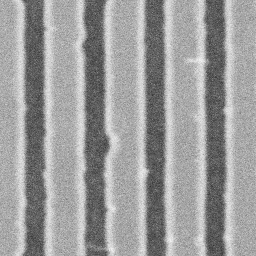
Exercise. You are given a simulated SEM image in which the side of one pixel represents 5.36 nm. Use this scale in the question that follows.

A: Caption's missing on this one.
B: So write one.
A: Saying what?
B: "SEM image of parallel lines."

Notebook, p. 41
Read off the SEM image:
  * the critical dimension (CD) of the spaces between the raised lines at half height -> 140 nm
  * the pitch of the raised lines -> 323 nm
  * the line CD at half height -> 0.179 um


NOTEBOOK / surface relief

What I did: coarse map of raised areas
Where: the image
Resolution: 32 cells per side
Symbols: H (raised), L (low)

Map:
HHHLLLHHHHLLLLHHHHLLLHHHHLLLLHHH
HHHLLLHHHHLLLHHHHHLLLHHHHLLLLHHH
HHHLLLHHHHLLLHHHHHLLLHHHHLLLLHHH
HHHLLLHHHHLLLHHHHHLLLHHHHLLLLHHH
HHHLLLHHHHLLLHHHHHLLLHHHHLLLLHHH
HHHLLLHHHHLLLHHHHHLLLHHHHLLLLHHH
HHHLLLHHHHLLLLHHHHLLLHHHHLLLLHHH
HHHLLLHHHHLLLLHHHHLLLHHHHLLLLHHH
HHHLLLHHHHLLLLHHHHLLLHHHHLLLLHHH
HHHLLLHHHHLLLLHHHHLLLHHHHLLLLHHH
HHHLLLHHHHLLLLHHHHLLLHHHHLLLHHHH
HHHLLLHHHHLLLHHHHHLLLHHHHLLLLHHH
HHHLLLHHHHLLLLHHHHLLLHHHHLLLLHHH
HHHLLLHHHHLLLLHHHHLLLHHHHLLLLHHH
HHHLLLHHHHLLLLHHHHLLLHHHHLLLLHHH
HHHLLLHHHHLLLLHHHHLLLHHHHLLLLHHH
HHHLLLHHHHLLLLHHHHLLLHHHHLLLLHHH
HHHLLLHHHHLLLLHHHHLLLHHHHLLLLHHH
HHHLLLHHHHLLLLHHHHLLLHHHHLLLLHHH
HHHLLLHHHHLLLLHHHHLLLHHHHLLLLHHH
HHHLLLHHHHLLLLHHHHLLLHHHHLLLLHHH
HHHLLLHHHHLLLHHHHHLLLHHHHLLLLHHH
HHHLLLHHHHLLLLHHHHLLLHHHHLLLLHHH
HHHLLLHHHHLLLLHHHHLLLHHHHLLLLHHH
HHHLLLHHHHLLLLHHHHLLLHHHHLLLHHHH
HHHLLLHHHHLLLLHHHHLLLHHHHLLLLHHH
HHHLLLHHHHLLLLHHHHLLLHHHHLLLLHHH
HHHLLLHHHHLLLLHHHHLLLHHHHLLLLHHH
HHHLLLHHHHLLLLHHHHLLLHHHHLLLLHHH
HHHLLLHHHHLLLLHHHHLLLHHHHLLLHHHH
HHHLLLHHHHLLLLHHHHLLLHHHHLLLLHHH
HHHLLLHHHHLLLLHHHHLLLHHHHLLLLHHH